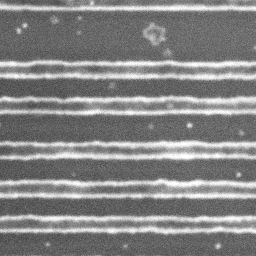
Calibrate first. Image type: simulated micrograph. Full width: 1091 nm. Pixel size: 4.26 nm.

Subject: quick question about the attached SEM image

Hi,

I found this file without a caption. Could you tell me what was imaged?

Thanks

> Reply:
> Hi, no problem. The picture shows lines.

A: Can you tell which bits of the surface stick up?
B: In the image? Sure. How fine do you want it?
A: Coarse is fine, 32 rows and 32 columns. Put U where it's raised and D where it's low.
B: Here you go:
UUUUUUUUUUUUUUUUUUUUUUUUUUUUUUUU
DDDDDDDDDDDDDDDDDDDDDDDDDDDDDDDD
DDDDDDDDDDDDDDDDDDDDDDDDDDDDDDDD
DDDDDDDDDDDDDDDDDDDDDDDDDDDDDDDD
DDDDDDDDDDDDDDDDDDDDDDDDDDDDDDDD
DDDDDDDDDDDDDDDDDDDDDDDDDDDDDDDD
DDDDDDDDDDDDDDDDDDDDDDDDDDDDDDDD
DDDDDDDDDDDDDDDDDDDDDDDDDDDDDDDD
UUUUUUUUUUUUUUUUUUUUUUUUUUUUUUUU
UUUUUUUUDUUUUUUUUUUUUUUUUUUUUUUU
DDDDDDDDDDDDDDDDDDDDDDDDDDDDDDDD
DDDDDDDDDDDDDDDDDDDDDDDDDDDDDDDD
UUUUUUUUUUUUUUUUUUUUUUUUUUDUDUUU
UUUUUUUUUUUUUUUUUUUUUUUUUUUUUUUU
DDDDDDDDDDDDDDDDDDDDDDDDDDDDDDDD
DDDDDDDDDDDDDDDDDDDDDDDDDDDDDDDD
DDDDDDDDDDDDDDDDDDDDDDDDDDDDDDDD
DDDDDDDDDDDDDDDDDDDDDDDDDDDDDDDD
UUUUUUUUUUUUUUUUUUUUUUUUUUUUUUUU
UUUUUUUUUUUUUUUUUUUUUUUUUUUUUUUU
DDDDDDDDDDDDDDDDDDDDDDDDDDDDDDDD
DDDDDDDDDDDDDDDDDDDDDDDDDDDDDDDD
DDDDDDDDDDDDDDDDDDDDDDDDDDDDDDDD
UUUUUUUUUUUUUUUUUUUUUUUUUUUUUUUU
UUUUUUUUUUUUUUUUUUUUUUUUUUUUUUUU
DDDDDDDDDDDDDDDDDDDDDDDDDDDDDDDD
DDDDDDDDDDDDDDDDDDDDDDDDDDDDDDDD
UUUUUUUUUUUUUUUUUUUUUUUUUUUUUUUU
UUUUUUUUUUUUUUUUUUUUUUUUUUUUUUUU
DDDDDDDDDDDDDDDDDDDDDDDDDDDDDDDD
DDDDDDDDDDDDDDDDDDDDDDDDDDDDDDDD
DDDDDDDDDDDDDDDDDDDDDDDDDDDDDDDD